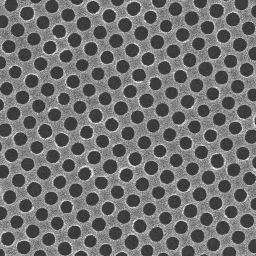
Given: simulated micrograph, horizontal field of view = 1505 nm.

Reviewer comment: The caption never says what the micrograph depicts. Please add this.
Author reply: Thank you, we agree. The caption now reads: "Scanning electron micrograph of a regular array of holes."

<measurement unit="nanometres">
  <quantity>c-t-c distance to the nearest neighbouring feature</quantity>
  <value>107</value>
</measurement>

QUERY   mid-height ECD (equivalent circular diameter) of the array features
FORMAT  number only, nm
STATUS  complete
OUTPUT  79.3